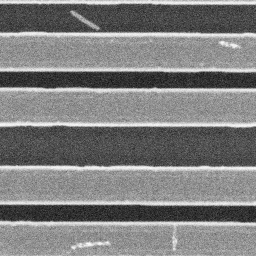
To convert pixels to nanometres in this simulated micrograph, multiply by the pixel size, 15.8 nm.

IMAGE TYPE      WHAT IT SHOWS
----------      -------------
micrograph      lines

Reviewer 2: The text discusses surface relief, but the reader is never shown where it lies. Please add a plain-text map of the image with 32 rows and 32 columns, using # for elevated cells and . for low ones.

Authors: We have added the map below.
................................
................................
................................
................................
################################
################################
################################
################################
################################
................................
................................
################################
################################
################################
################################
################################
................................
................................
................................
................................
................................
################################
################################
################################
################################
..................#.############
................................
................................
################################
################################
################################
################################